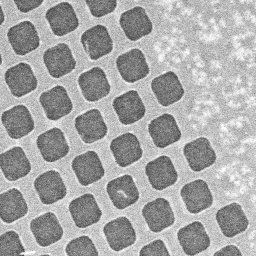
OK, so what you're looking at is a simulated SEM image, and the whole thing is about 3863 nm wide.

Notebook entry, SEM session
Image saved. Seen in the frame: a regular array of holes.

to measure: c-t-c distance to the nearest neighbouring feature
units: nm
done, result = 633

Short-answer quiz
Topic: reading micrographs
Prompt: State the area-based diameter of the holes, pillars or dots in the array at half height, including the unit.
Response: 498 nanometres